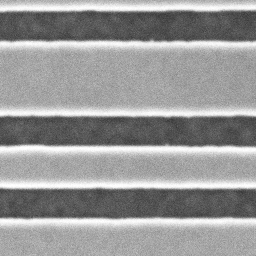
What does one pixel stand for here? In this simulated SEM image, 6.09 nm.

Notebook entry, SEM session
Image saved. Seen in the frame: lines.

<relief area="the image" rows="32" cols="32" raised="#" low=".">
################################
................................
................................
................................
................................
################################
################################
################################
################################
################################
################################
################################
################################
################################
....................#..#........
................................
................................
................................
################################
################################
################################
################################
################################
................................
................................
................................
................................
###.##########.#################
################################
################################
################################
################################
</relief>